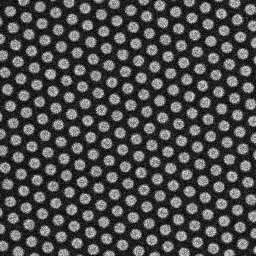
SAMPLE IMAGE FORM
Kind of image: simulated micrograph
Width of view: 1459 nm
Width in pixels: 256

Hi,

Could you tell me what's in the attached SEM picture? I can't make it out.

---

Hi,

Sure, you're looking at a regular array of raised bodies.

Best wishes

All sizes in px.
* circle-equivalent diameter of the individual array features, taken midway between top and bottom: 10.8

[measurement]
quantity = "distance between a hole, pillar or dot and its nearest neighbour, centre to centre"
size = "96.2 nm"